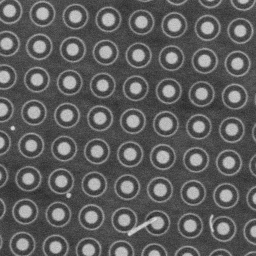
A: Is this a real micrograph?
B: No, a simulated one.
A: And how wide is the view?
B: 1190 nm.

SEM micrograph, an array of small figures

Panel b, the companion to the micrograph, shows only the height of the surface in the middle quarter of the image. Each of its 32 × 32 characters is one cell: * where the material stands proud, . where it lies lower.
*****************...*****....***
********************************
...******.**********************
....***.....*****..*************
....***.....***.....****....****
....***......**......**......***
....***.....***......**......***
*.******....***.....***......**.
****************....****.....***
*************************..*****
..******************************
...****....*****..**************
....**......***.....****...*****
....**......**......***.....****
...***......**......***.....***.
..*****....****.....***.....***.
********.******....****.....***.
************************...****.
.*******************************
..****....**********************
...***.....***.....*****..******
...**......***.....***.....****.
...**......**.......**.....***..
..****.....***.....***......**..
*******...****.....***.....***..
****************.******....***..
********************************
.*****...***********************
..***.....****....*****.********
..***.....***.....****....*****.
..***.....***......**......***..
.****.....***......**......**...